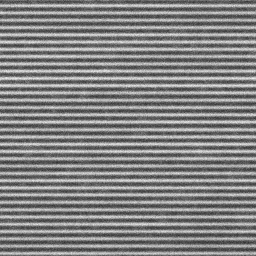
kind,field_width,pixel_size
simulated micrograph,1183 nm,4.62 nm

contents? parallel lines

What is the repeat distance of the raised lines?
33.6 nm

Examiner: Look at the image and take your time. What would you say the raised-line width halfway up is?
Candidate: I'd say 8.7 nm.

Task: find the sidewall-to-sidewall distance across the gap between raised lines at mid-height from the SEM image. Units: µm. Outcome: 0.0248